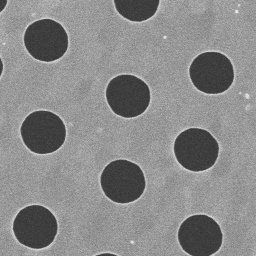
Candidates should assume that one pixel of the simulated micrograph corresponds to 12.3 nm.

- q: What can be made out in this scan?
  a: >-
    holes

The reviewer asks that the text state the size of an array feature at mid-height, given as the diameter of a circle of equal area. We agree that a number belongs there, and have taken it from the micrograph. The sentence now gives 544 nanometres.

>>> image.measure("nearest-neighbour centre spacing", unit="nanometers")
1050